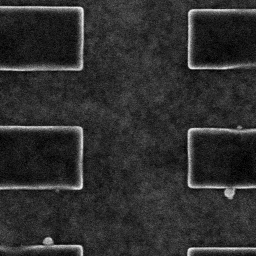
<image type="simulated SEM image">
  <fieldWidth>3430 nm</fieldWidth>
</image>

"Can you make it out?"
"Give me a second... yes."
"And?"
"wiring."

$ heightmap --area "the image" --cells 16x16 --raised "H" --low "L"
HHHHHLLLLLLLLLLL
HHHHHLLLLLLLHHHH
HHHHHLLLLLLLHHHH
HHHHHLLLLLLLHHHH
LLLLLLLLLLLLLLLL
LLLLLLLLLLLLLLLL
LLLLLLLLLLLLLLLL
LLLLLLLLLLLLLLLL
HHHHHLLLLLLLHHHH
HHHHHLLLLLLLHHHH
HHHHHLLLLLLLHHHH
HHHHHLLLLLLLHHHH
LLLLLLLLLLLLLLLL
LLLLLLLLLLLLLLLL
LLLLLLLLLLLLLLLL
LHHHHLLLLLLLHHLL